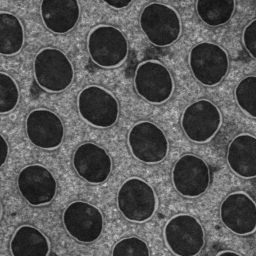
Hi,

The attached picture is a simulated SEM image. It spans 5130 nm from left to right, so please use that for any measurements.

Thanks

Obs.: a regular array of holes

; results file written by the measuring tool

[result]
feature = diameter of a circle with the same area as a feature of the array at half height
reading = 793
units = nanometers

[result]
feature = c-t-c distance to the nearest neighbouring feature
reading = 1140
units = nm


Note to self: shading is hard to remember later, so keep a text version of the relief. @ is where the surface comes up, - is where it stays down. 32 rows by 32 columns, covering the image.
@@@@@-----@@@@--@@@-@@@@@----@@@
@@@@@-----@@@@@@@@----@@@----@@@
--@@@-----@@@@@@@@----@@@---@@@@
---@@@---@@@--@@@@-----@@@@@@@@-
---@@@@@@@@----@@@----@@@@@@@@@-
---@@@@@@@@-----@@@--@@@@--@@@@-
--@@@---@@@-----@@@@@@@@----@@@-
@@@@-----@@@---@@@@@@@@@----@@@@
@@@@-----@@@@@@@@----@@@----@@@@
-@@@-----@@@@@@@@----@@@----@@@@
--@@@----@@@@@@@@-----@@@@-@@@--
--@@@@@@@@---@@@@----@@@@@@@@---
--@@@@@@@@----@@@@---@@@@@@@@@--
--@@@@@@@@-----@@@@@@@@----@@@--
@@@@---@@@-----@@@@@@@@-----@@@-
@@@-----@@@@--@@@--@@@@----@@@@@
@@@-----@@@@@@@@----@@@----@@@@@
-@@@----@@@@@@@@-----@@@--@@@---
-@@@@@@@@@---@@@-----@@@@@@@@---
-@@@@@@@@-----@@@----@@-@@@@@---
@@@@@@@@@-----@@@@@@@@----@@@---
@@@---@@@@----@@@@@@@@----@@@---
@@-----@@@@--@@@--@@@@----@@@@@@
@@-----@@@@@@@@----@@@----@@@@@@
@@@----@@@@@@@@----@@@@--@@@@--@
@@@@-@@@@--@@@@-----@@@@@@@@----
@@@@@@@@----@@@----@@@@@@@@@----
@@@@@@@@-----@@@--@@@----@@@----
@@@-@@@@-----@@@@@@@@----@@@@---
@@---@@@@---@@@@@@@@@----@@@@@@@
@-----@@@@@@@@@---@@@----@@@@@@@
@@----@@@@@@@@-----@@@---@@@-@@@